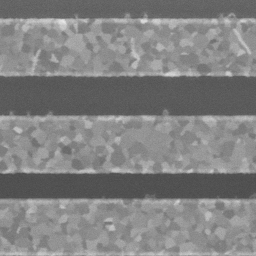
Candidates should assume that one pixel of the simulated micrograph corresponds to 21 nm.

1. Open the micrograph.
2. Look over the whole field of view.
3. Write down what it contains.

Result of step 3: lines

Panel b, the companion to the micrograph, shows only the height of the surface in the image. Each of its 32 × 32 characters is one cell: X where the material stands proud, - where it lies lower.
--------------------------------
--------------------------------
-X---XXXX-XXXXXXXXX-XX-XXXXX-XXX
XXXXXXXXXXXXXXXXXXXXXXXXXXXXXXXX
XXXXXXXXXXXXXXXXXXXXXXXXXXXXXXXX
XXXXXXXXXXXXXXXXXXXXXXXXXXXXXXXX
XXXXXXXXXXXXXXXXXXXXXXXXXXXXXXXX
XXXXXXXXXXXXXXXXXXXXXXXXXXXXXXXX
XXXXXXXXXXXXXXXXXXXXXXXXXXXXXXXX
XX---X---XXXXXX--X---X--X---X-XX
--------------------------------
--------------------------------
--------------------------------
--------------------------------
--------------------------------
XXXXXXXXXXXXXXXXXXXXXXXXXXXXXXXX
XXXXXXXXXXXXXXXXXXXXXXXXXXXXXXXX
XXXXXXXXXXXXXXXXXXXXXXXXXXXXXXXX
XXXXXXXXXXXXXXXXXXXXXXXXXXXXXXXX
XXXXXXXXXXXXXXXXXXXXXXXXXXXXXXXX
XXXXXXXXXXXXXXXXXXXXXXXXXXXXXXXX
XXXXXXXXXXXXXXXXXXXXXXXXXXXXXXXX
--------------------------------
--------------------------------
--------------------------------
XXXXXXXXXXXXXXXXXXXXXXXXXXXXXXXX
XXXXXXXXXXXXXXXXXXXXXXXXXXXXXXXX
XXXXXXXXXXXXXXXXXXXXXXXXXXXXXXXX
XXXXXXXXXXXXXXXXXXXXXXXXXXXXXXXX
XXXXXXXXXXXXXXXXXXXXXXXXXXXXXXXX
XXXXXXXXXXXXXXXXXXXXXXXXXXXXXXXX
XXXXXXXXXXXXXXXXXXXXXXXXXXXXXXXX